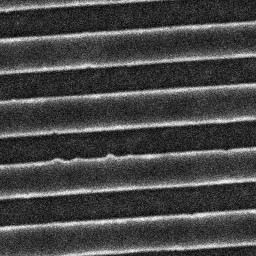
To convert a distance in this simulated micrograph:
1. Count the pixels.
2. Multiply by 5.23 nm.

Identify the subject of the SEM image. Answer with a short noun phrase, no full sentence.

one or a few lines or trenches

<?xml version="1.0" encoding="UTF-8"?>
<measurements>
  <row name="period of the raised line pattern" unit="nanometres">327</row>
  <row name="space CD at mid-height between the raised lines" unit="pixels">28.9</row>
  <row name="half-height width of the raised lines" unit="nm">175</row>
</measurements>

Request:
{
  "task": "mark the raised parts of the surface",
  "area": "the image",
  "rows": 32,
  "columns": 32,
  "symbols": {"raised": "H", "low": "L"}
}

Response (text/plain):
HHHHHHHHHHHLLLLLLLLLLLLLLLLLLLLL
LLLLLLLLLLLLLLLLLLLLLLLLLLLLLLLL
LLLLLLLLLLLLLLLLLLLLLLLLLLLLLLLL
LLLLLLLLLLLLLLLLLLLLLHHHHHHHHHHH
LLLLLLLLHHHHHHHHHHHHHHHHHHHHHHHH
HHHHHHHHHHHHHHHHHHHHHHHHHHHHHHHH
HHHHHHHHHHHHHHHHHHHHHHHHHHHHHHHH
HHHHHHHHHHHHHHHHHHHHHHHHLLLLLLLL
HHHHHHHHHHLLLLLLLLLLLLLLLLLLLLLL
LLLLLLLLLLLLLLLLLLLLLLLLLLLLLLLL
LLLLLLLLLLLLLLLLLLLLLLLLLLLLLLLL
LLLLLLLLLLLLLLLLLLHHHHHHHHHHHHHH
LLLHHHHHHHHHHHHHHHHHHHHHHHHHHHHH
HHHHHHHHHHHHHHHHHHHHHHHHHHHHHHHH
HHHHHHHHHHHHHHHHHHHHHHHHHHHHHHHH
HHHHHHHHHHHHHHHHHHHHHHHLLLLLLLLL
HHHHHHHHLLLLLLLLLLLLLLLLLLLLLLLL
LLLLLLLLLLLLLLLLLLLLLLLLLLLLLLLL
LLLLLLLLLLLLLLLLLLLLLLLLLLLLLLLL
LLLLLLLLLLLLLHLLLLHHHHHHHHHHHHHH
LLLLHHHHHHHHHHHHHHHHHHHHHHHHHHHH
HHHHHHHHHHHHHHHHHHHHHHHHHHHHHHHH
HHHHHHHHHHHHHHHHHHHHHHHHHHHHHHHH
HHHHHHHHHHHHHHHHHHLLLLLLLLLLLLLL
HHHHLLLLLLLLLLLLLLLLLLLLLLLLLLLL
LLLLLLLLLLLLLLLLLLLLLLLLLLLLLLLL
LLLLLLLLLLLLLLLLLLLLLLLLLLLLLHHH
LLLLLLLLLLLLLLLHHHHHHHHHHHHHHHHH
LHHHHHHHHHHHHHHHHHHHHHHHHHHHHHHH
HHHHHHHHHHHHHHHHHHHHHHHHHHHHHHHH
HHHHHHHHHHHHHHHHHHHHHHHHHHHHHHHH
HHHHHHHHHHHHHHHLLLLLLLLLLLLLLLLL